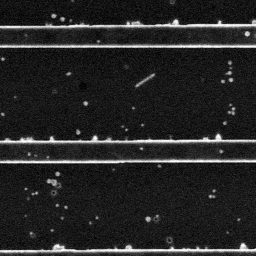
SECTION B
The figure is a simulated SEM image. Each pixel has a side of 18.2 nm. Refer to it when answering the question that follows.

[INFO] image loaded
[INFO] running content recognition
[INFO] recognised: lines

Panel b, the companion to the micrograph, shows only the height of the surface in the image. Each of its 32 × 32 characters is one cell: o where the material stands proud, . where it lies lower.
................................
................................
................................
oooooooooooooooooooooooooooooooo
oooooooooooooooooooooooooooooooo
oooooooooooooooooooooooooooooooo
................................
................................
................................
................................
................................
................................
................................
................................
................................
................................
................................
................................
oooooooooooooooooooooooooooooooo
oooooooooooooooooooooooooooooooo
................................
................................
................................
................................
................................
................................
................................
................................
................................
................................
................................
oooooooooooooooooooooooooooooooo